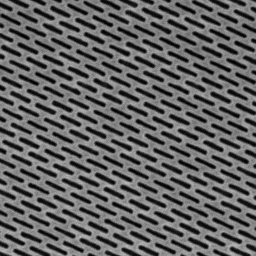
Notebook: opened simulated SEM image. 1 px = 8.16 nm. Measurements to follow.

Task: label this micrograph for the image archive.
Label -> a regular array of holes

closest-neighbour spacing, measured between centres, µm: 0.134